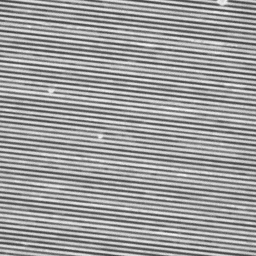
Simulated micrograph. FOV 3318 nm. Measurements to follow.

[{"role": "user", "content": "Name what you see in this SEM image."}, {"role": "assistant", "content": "parallel lines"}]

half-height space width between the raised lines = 2.98 pixels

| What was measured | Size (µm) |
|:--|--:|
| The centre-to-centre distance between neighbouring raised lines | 0.065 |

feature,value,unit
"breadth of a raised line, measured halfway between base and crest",25.7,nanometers